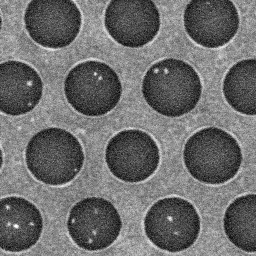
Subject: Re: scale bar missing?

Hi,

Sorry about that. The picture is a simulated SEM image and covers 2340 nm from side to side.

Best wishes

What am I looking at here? holes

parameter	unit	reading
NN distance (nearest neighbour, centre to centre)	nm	716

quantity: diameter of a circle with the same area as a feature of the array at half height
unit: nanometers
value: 532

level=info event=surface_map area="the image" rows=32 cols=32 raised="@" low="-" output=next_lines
@@@------@@@@------@@@@------@@@
@@@-------@@@-------@@@-------@@
@@@-------@@@-------@@@-------@@
@@@-------@@@-------@@@-------@@
@@@@------@@@@------@@@@-----@@@
@@@@@----@@@@@@----@@@@@@---@@@@
@@@@@@@@@@@@@@@@@@@@@@@@@@@@@@@@
@@@@@@@@@@@-@@@@@@@@---@@@@@@@--
----@@@@@-----@@@@@-----@@@@@---
-----@@@-------@@@-------@@@----
-----@@@-------@@@-------@@@----
-----@@@-------@@@-------@@@----
-----@@@-------@@@-------@@@----
----@@@@@-----@@@@@-----@@@@@---
@-@@@@@@@@@--@@@@@@@@--@@@@@@@@-
@@@@@@@@@@@@@@@@@@@@@@@@@@@@@@@@
@@@@@----@@@@@@---@@@@@@----@@@@
@@@@------@@@@-----@@@@-------@@
@@@-------@@@-------@@@-------@@
@@@--------@@-------@@@-------@@
@@@-------@@@-------@@@-------@@
@@@@------@@@@-----@@@@-------@@
@@@@@----@@@@@@---@@@@@@-----@@@
@@@@@@@@@@@@@@@@@@@@@@@@@@@@@@@@
@-@@@@@@@@@@@@@@@@@@@-@@@@@@@@--
----@@@@@-----@@@@@-----@@@@@---
-----@@@@------@@@-------@@@----
-----@@@-------@@@-------@@@----
-----@@@-------@@@-------@@@----
-----@@@@------@@@-------@@@----
----@@@@@-----@@@@@-----@@@@@---
@--@@@@@@@@@@@@@@@@@@-@@@@@@@@@-